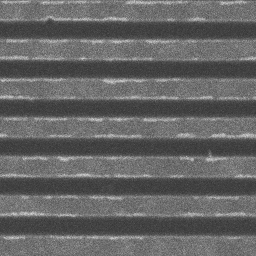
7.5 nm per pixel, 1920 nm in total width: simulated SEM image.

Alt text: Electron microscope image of parallel lines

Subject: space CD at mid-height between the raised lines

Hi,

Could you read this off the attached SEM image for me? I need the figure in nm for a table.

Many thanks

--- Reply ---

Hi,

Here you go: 119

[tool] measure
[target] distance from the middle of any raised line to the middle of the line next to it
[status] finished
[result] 293 nm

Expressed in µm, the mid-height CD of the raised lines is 0.174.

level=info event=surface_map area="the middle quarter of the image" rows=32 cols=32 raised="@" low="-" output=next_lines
--------------------------------
--------------------------------
--------------------------------
@@@@@@@@@@@@@@@@@@@@@-----------
@@@@@@@@@@@@@@@@@@@@@@@@@@@@@@@@
@@@@@@@@@@@@@@@@@@@@@@@@@@@@@@@@
@@@@@@@@@@@@@@@@@@@@@@@@@@@@@@@@
@@@@@@@@@@@@@@@@@@@@@@@@@@@@@@@@
@@@@@@@@@@@@@@@@@@@@@@@@@@@@@@@@
--------------------------------
--------------------------------
--------------------------------
--------------------------------
@@@@@@@@@@@@@@@@@@@@@@@@@@@@@@@@
@@@@@@@@@@@@@@@@@@@@@@@@@@@@@@@@
@@@@@@@@@@@@@@@@@@@@@@@@@@@@@@@@
@@@@@@@@@@@@@@@@@@@@@@@@@@@@@@@@
@@@@@@@@@@@@@@@@@@@@@@@@@@@@@@@@
@@@@@@@@@@@@@@@@@@@@@@@@@@@@@@@@
--------------------------------
--------------------------------
--------------------------------
--------------------------------
@@@@@@@@@@@@@@@@@@@@@@@@@@@@@@@@
@@@@@@@@@@@@@@@@@@@@@@@@@@@@@@@@
@@@@@@@@@@@@@@@@@@@@@@@@@@@@@@@@
@@@@@@@@@@@@@@@@@@@@@@@@@@@@@@@@
@@@@@@@@@@@@@@@@@@@@@@@@@@@@@@@@
@@----@@---@@@@@@@@@@@@@@@--@@--
--------------------------------
--------------------------------
--------------------------------